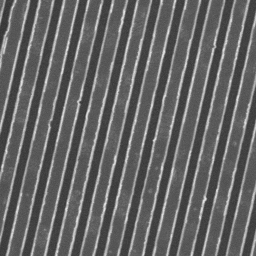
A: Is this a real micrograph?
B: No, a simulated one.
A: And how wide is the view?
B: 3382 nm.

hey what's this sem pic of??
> parallel lines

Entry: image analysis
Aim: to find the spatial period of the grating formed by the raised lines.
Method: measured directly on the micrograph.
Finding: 315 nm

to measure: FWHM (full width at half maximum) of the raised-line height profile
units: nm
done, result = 189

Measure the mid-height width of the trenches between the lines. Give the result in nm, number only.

122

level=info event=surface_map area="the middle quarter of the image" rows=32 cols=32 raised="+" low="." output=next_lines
..++++...+++...+++...+++...+++..
..++++..++++...+++...+++...+++..
..++++..++++..++++..++++..++++..
..+++...+++...+++...++++..++++..
..+++...+++...+++...+++...+++...
.++++..++++...+++...+++...+++...
.++++..++++..++++..++++..++++..+
.+++...++++..++++..++++..++++..+
.+++...+++...+++...++++..++++..+
++++..++++...+++...+++...+++...+
++++..++++...+++...+++...+++...+
+++...++++..++++..++++..++++..++
+++...+++...+++...++++..++++..++
+++..++++...+++...+++...+++...++
+++..++++...+++...+++...+++...++
++...++++..++++..++++..++++..+++
++...+++...++++..++++..++++..+++
++...+++...+++...++++..++++..+++
++..++++...+++...+++...+++...+++
++..++++..++++..++++..++++...+++
++..++++..++++..++++..++++..++++
+...+++...+++...++++..++++..++++
+...+++...+++...+++...++++..+++.
+..++++...+++...+++...+++...+++.
+..++++..++++..++++..++++..++++.
...+++...++++..++++..++++..++++.
...+++...+++...+++...++++..++++.
..++++...+++...+++...+++...++++.
..++++..++++..++++...+++...+++..
..++++..++++..++++..++++..++++..
..+++...+++...++++..++++..++++..
..+++...+++...+++...+++...+++...